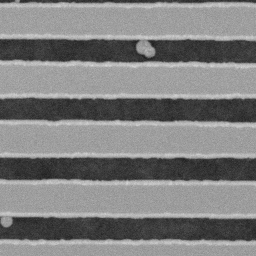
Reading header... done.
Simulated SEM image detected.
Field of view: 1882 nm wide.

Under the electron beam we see lines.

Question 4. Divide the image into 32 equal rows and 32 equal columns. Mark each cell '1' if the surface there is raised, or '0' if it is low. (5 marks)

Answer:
01011101110001000001111001111111
11111111111111111111111111111111
11111111111111111111111111111111
11111111111111111111111111111111
11111111111111111111111111111111
00000000000000000000000000000000
00000000000000000000000000000000
00000000000000000000000000000000
11111111111111111111111111111111
11111111111111111111111111111111
11111111111111111111111111111111
11111111111111111111111111111111
00000000000000000000000000000000
00000000000000000000000000000000
00000000000000000000000000000000
11111111111111111111111111111111
11111111111111111111111111111111
11111111111111111111111111111111
11111111111111111111111111111111
11111111111111111111111111111111
00000000000000000000000000000000
00000000000000000000000000000000
00000000000000000000000000000000
11111111111111111111111111111111
11111111111111111111111111111111
11111111111111111111111111111111
11111111111111111111111111111111
00000000000000000000000000000000
00000000000000000000000000000000
00000000000000000000000000000000
11111111111111111111111111111111
11111111111111111111111111111111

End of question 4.